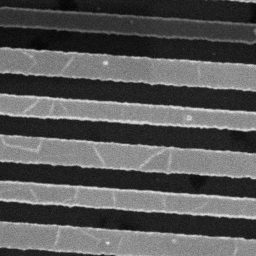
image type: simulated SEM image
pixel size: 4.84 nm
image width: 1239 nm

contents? lines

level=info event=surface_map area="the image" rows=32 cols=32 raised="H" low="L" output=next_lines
LLLLLLLLLLLLLLLLLLLLLLLLLLLLLLLL
HHHHHHHHHHLLLLLLLLLLLLLLLLLLLLLL
HHHHHHHHHHHHHHHHHHHHHHHHLLLLLLLL
LLLLLHHHHHHHHHHHHHHHHHHHHHHHHHHH
LLLLLLLLLLLLLLLLLLHHHHHHHHHHHHHH
LLLLLLLLLLLLLLLLLLLLLLLLLLLLLLLL
HHHHHHHHLLLLLLLLLLLLLLLLLLLLLLLL
HHHHHHHHHHHHHHHHHHHHHHLLLLLLLLLL
HHHHHHHHHHHHHHHHHHHHHHHHHHHHHHHH
LLLLLLHHHHHHHHHHHHHHHHHHHHHHHHHH
LLLLLLLLLLLLLLLLLLLLHHHHHHHHHHHH
LLLLLLLLLLLLLLLLLLLLLLLLLLLLLLLL
HHHHHHHHHHHLLLLLLLLLLLLLLLLLLLLL
HHHHHHHHHHHHHHHHHHHHHHHHLLLLLLLL
LHHHHHHHHHHHHHHHHHHHHHHHHHHHHHHH
LLLLLLLLLLLLLLLLLLLHHHHHHHHHHHHH
LLLLLLLLLLLLLLLLLLLLLLLLLLLLLLLL
HHHHHHHHHHLLLLLLLLLLLLLLLLLLLLLL
HHHHHHHHHHHHHHHHHHHHHHLLLLLLLLLL
HHHHHHHHHHHHHHHHHHHHHHHHHHHHHHHH
LLLLLLHHHHHHHHHHHHHHHHHHHHHHHHHH
LLLLLLLLLLLLLLLLLLLLHHHHHHHHHHHH
LLLLLLLLLLLLLLLLLLLLLLLLLLLLLLLL
HHHHHHHHHHHHLLLLLLLLLLLLLLLLLLLL
HHHHHHHHHHHHHHHHHHHHHHHHHHHHLLLL
LLLLHHHHHHHHHHHHHHHHHHHHHHHHHHHH
LLLLLLLLLLLLLLLLLLLLHHHHHHHHHHHH
LLLLLLLLLLLLLLLLLLLLLLLLLLLLLLLL
HHHHHHHHHHHHLLLLLLLLLLLLLLLLLLLL
HHHHHHHHHHHHHHHHHHHHHHHHHHLLLLLL
HHHHHHHHHHHHHHHHHHHHHHHHHHHHHHHH
LLLLLLLLLHHHHHHHHHHHHHHHHHHHHHHH